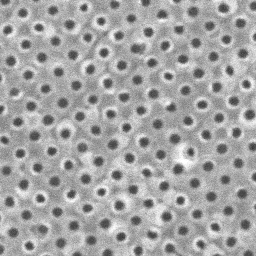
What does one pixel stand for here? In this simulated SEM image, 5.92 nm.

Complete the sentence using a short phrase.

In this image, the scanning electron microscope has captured a regular array of holes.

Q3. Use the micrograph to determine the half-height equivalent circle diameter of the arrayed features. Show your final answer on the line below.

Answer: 0.0634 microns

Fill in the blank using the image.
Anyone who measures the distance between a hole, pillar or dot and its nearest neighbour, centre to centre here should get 126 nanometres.